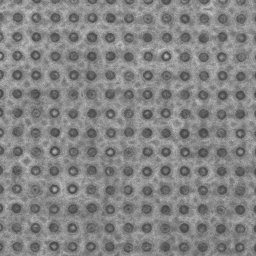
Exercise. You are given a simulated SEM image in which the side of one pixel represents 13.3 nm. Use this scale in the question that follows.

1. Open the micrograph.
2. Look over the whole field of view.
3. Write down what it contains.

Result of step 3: a regular array of holes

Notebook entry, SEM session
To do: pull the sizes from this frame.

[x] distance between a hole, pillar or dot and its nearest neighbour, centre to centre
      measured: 18.3 px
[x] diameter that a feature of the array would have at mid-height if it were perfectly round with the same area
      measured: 140 nanometers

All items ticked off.